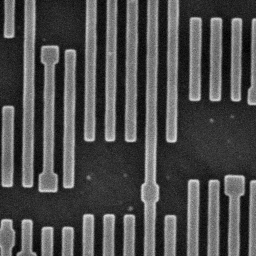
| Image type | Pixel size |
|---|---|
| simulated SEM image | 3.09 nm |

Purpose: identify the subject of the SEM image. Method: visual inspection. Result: wiring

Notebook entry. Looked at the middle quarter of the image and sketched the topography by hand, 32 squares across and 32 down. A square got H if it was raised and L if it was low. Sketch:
HHHLLHHHLLLHHLLLHHLLLHHLLLHHLLLL
HHHLLHHHLLLHHLLLHHLLLHHLLLHHLLLL
HHHLLHHHLLLHHLLLHHLLLHHLLLHHLLLL
HHHLLHHHLLLHHLLLHHLLLHHLLLHHLLLL
HHHLLHHHLLLHHLLLHHLLLHHLLLHHLLLH
HHHLLHHHLLLHHLLLHHLLLHHLLLHHLLLH
HHHLLHHHLLLHHLLLHHLLLHHLLLHHLLLH
HHHLLHHHLLLHHLLLHHLLLHHLLLHHLLLH
HHHLLHHHLLLHHLLLHHLLLHHLLLHHLLLH
HHHLLHHHLLLHHLLLHHLLLHHLLLHHLLLL
HHLLLHHHLLLHHLLLHHLLLHHLLLHHLLLL
HHLLLHHHLLLHHLLLHHLLLHHLLLHHLLLL
HHLLLHHHLLHHHLLHHHLLLHHLLLHHLLLL
HHLLLHHHLLHHHLLHHHLLLHHLLLHHLLLL
HHLLLHHHLLHHHLLHHHLLLHHLLLHHLLLL
HHLLLHHHLLHHHLLHHHLLLHHLLLHHLLLL
HHLLLHHHLLHHHLLHHHLLLHHLLLHHLLLL
HHLLLHHLLLHHHLLHHHLLLHHLLLHHLLLL
HHLLLHHLLLHHHLLHHHLLLHHLLLHHLLLL
HHLLLLLLLLLLLLLLLLLLLHHLLLLLLLLL
HHLLLLLLLLLLLLLLLLLLLHHLLLLLLLLL
HHLLLLLLLLLLLLLLLLLLLHHLLLLLLLLL
HHLLLLLLLLLLLLLLLLLLLHHLLLLLLLLL
HHLLLLLLLLLLLLLLLLLLLHHLLLLLLLLL
HHLLLLLLLLLLLLLLLLLLLHHLLLLLLLLL
HHLLLLLLLLLLLLLLLLLLLHHLLLLLLLLL
HHLLLLLLLLLLLLLLLLLLLHHLLLLLLLLL
HHLLLLLLLLLLLLLLLLLLLHHLLLLLLLLL
HHLLLLLLLLLLLLLLLLLLHHHLLLLLLLLL
HHLLLLLLLLLLLLLLLLLLHHHLLLLLLLLH
HHLLLLLLLLLLLLLLLLLLHHHHLLLLLLLH
LLLLLLLLLLLLLLLLLLLLHHHHLLLLLLLH